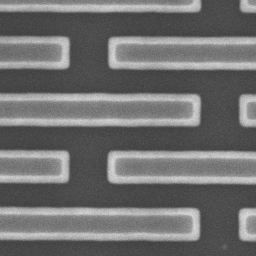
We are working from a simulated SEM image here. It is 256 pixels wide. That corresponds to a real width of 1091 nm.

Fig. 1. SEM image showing groups of lines, slits or small figures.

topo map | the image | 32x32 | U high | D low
UUUUUUUUUUUUUUUUUUUUUUUUUDDDDDUU
DDDDDDDDDDDDDDDDDDDDDDDDDDDDDDDD
DDDDDDDDDDDDDDDDDDDDDDDDDDDDDDDD
DDDDDDDDDDDDDDDDDDDDDDDDDDDDDDDD
DDDDDDDDDDDDDDDDDDDDDDDDDDDDDDDD
UUUUUUUUDDDDDDUUUUUUUUUUUUUUUUUU
UUUUUUUUDDDDDDUUUUUUUUUUUUUUUUUU
UUUUUUUUDDDDDDUUUUUUUUUUUUUUUUUU
DDDDDDDDDDDDDDDDDDDDDDDDDDDDDDDD
DDDDDDDDDDDDDDDDDDDDDDDDDDDDDDDD
DDDDDDDDDDDDDDDDDDDDDDDDDDDDDDDD
DDDDDDDDDDDDDDDDDDDDDDDDDDDDDDDD
UUUUUUUUUUUUUUUUUUUUUUUUDDDDDDDU
UUUUUUUUUUUUUUUUUUUUUUUUUDDDDDUU
UUUUUUUUUUUUUUUUUUUUUUUUUDDDDDUU
DDDDDDDDDDDDDDDDDDDDDDDDDDDDDDDD
DDDDDDDDDDDDDDDDDDDDDDDDDDDDDDDD
DDDDDDDDDDDDDDDDDDDDDDDDDDDDDDDD
DDDDDDDDDDDDDDDDDDDDDDDDDDDDDDDD
UUUUUUUUDDDDDDUUUUUUUUUUUUUUUUUU
UUUUUUUUDDDDDDUUUUUUUUUUUUUUUUUU
UUUUUUUUDDDDDDUUUUUUUUUUUUUUUUUU
DDDDDDDDDDDDDDUUUUUUUUUUUUUUUUUU
DDDDDDDDDDDDDDDDDDDDDDDDDDDDDDDD
DDDDDDDDDDDDDDDDDDDDDDDDDDDDDDDD
DDDDDDDDDDDDDDDDDDDDDDDDDDDDDDDD
UUUUUUUUUUUUUUUUUUUUUUUUDDDDDDDD
UUUUUUUUUUUUUUUUUUUUUUUUUDDDDDUU
UUUUUUUUUUUUUUUUUUUUUUUUUDDDDDUU
UUUUUUUUUUUUUUUUUUUUUUUUDDDDDDDU
DDDDDDDDDDDDDDDDDDDDDDDDDDDDDDDD
DDDDDDDDDDDDDDDDDDDDDDDDDDDDDDDD